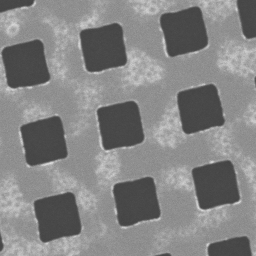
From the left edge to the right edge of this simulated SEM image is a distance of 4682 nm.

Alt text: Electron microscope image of a regular array of holes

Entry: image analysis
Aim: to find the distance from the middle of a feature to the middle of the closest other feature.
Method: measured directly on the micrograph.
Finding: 1420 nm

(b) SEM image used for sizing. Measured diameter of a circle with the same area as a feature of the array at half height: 48.6 px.